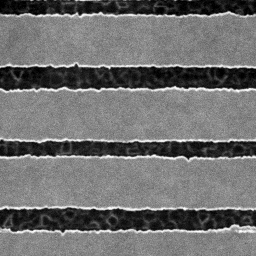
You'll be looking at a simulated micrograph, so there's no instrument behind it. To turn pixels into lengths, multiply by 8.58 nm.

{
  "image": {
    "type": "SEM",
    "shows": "one or a few lines or trenches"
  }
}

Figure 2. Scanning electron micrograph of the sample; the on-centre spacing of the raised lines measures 611 nm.